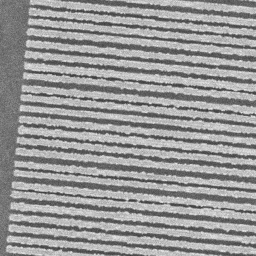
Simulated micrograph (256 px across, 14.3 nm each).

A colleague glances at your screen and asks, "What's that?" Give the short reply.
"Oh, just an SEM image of parallel lines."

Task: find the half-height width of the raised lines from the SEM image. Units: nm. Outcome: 90.7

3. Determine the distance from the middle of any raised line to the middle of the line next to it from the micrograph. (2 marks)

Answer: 155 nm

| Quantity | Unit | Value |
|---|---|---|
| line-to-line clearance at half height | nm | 65.8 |